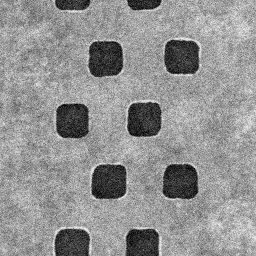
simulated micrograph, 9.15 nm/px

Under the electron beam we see holes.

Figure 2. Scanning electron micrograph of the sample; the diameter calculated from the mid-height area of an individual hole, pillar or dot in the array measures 38.5 pixels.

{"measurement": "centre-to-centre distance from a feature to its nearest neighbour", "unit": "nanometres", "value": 650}